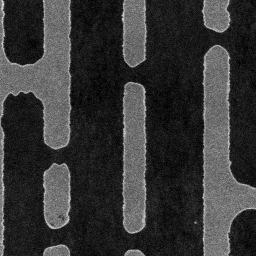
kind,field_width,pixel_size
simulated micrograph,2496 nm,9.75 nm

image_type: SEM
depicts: one or a few lines or trenches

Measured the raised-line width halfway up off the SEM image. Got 230 nanometres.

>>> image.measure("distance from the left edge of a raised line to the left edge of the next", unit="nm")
780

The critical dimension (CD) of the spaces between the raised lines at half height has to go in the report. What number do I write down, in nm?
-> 528